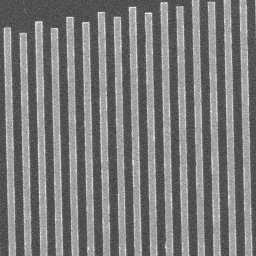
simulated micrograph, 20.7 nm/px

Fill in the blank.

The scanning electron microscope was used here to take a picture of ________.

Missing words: parallel lines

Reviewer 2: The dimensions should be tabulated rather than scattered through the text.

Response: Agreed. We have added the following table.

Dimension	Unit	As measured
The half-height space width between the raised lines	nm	189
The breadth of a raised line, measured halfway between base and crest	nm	140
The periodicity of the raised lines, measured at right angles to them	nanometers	326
